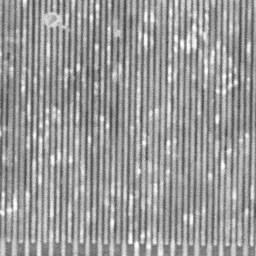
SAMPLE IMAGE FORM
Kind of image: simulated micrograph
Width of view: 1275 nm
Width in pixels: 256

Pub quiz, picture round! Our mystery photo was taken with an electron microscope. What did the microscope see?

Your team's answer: parallel lines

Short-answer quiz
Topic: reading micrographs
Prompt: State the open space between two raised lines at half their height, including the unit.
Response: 13.1 nm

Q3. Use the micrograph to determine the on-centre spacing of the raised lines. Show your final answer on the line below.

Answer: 6.08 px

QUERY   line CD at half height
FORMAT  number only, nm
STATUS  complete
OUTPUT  17.4